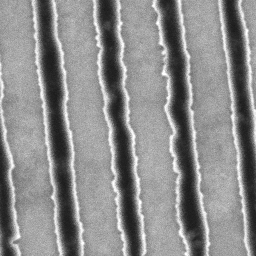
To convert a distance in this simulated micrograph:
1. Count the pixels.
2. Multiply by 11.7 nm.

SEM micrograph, one or a few lines or trenches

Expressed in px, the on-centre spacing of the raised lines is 62.1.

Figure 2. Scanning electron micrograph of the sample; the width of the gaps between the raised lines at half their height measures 455 nanometres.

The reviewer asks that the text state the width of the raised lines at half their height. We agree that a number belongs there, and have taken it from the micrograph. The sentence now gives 278 nm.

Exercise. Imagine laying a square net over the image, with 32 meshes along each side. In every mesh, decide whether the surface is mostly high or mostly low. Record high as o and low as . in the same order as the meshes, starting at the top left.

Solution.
....ooo.....ooo....oooo....ooo..
....ooo.....ooo.....ooo....ooo..
....ooo.....ooo.....ooo.....oo..
....ooo.....ooo.....ooo.....ooo.
....ooo.....ooo.....ooo.....ooo.
.....ooo....ooo.....ooo.....ooo.
....oooo....ooo......oo.....ooo.
.....ooo....ooo......ooo....ooo.
.....ooo....oooo....oooo....ooo.
.....ooo....oooo.....ooo.....oo.
.....ooo.....ooo.....ooo.....oo.
.....ooo.....ooo.....ooo.....oo.
.....ooo.....ooo.....ooo.....ooo
.....ooo.....ooo.....ooo.....ooo
......oo.....ooo.....ooo.....ooo
o.....ooo....ooo.....ooo.....ooo
o.....ooo.....ooo.....oo.....ooo
o.....ooo.....ooo....ooo.....ooo
o.....ooo.....ooo....ooo......oo
o.....ooo.....ooo.....ooo.....oo
oo....ooo.....ooo.....ooo.....oo
o.....ooo.....ooo.....ooo.....oo
o.....ooo.....ooo.....ooo.....oo
oo.....oo.....ooo.....ooo.....oo
oo.....ooo.....oo.....ooo.....oo
oo.....ooo.....ooo....ooo.....oo
oo.....ooo.....ooo....oooo....oo
oo.....ooo.....ooo....oooo.....o
oo.....ooo.....ooo.....ooo.....o
oo.....ooo.....ooo.....ooo.....o
oo.....ooo.....ooo.....ooo.....o
oo.....ooo.....ooo.....ooo.....o